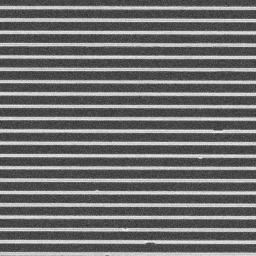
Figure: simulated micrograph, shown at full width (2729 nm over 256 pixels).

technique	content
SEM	parallel lines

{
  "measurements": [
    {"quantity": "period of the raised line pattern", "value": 131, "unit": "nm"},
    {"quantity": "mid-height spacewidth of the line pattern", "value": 99.9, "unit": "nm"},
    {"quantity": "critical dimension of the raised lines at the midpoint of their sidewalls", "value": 26.7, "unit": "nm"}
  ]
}